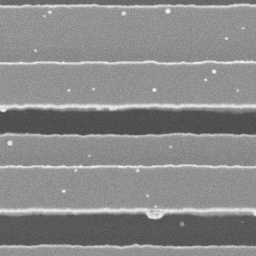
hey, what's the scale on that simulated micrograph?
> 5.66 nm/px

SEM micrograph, lines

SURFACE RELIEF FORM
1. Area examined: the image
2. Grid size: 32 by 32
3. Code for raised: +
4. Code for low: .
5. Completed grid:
................................
++++++++++++++++++++++++++++++++
++++++++++++++++++++++++++++++++
++++++++++++++++++++++++++++++++
++++++++++++++++++++++++++++++++
++++++++++++++++++++++++++++++++
++++++++++++++++++++++++++++++++
++++++++++++++++++++++++++++++++
++++++++++++++++++++++++++++++++
++++++++++++++++++++++++++++++++
++++++++++++++++++++++++++++++++
++++++++++++++++++++++++++++++++
++++++++++++++++++++++++++++++++
+...........+++.................
................................
................................
................................
++++++++++++++++++++++++++++++++
++++++++++++++++++++++++++++++++
++++++++++++++++++++++++++++++++
++++++++++++++++++++++++++++++++
++++++++++++++++++++++++++++++++
++++++++++++++++++++++++++++++++
++++++++++++++++++++++++++++++++
++++++++++++++++++++++++++++++++
++++++++++++++++++++++++++++++++
.........+........+++..........+
................................
................................
................................
................................
++++++++++++++++++++++++++++++++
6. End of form